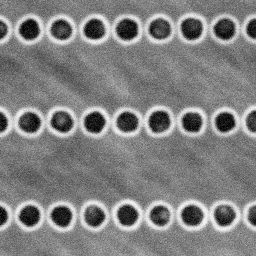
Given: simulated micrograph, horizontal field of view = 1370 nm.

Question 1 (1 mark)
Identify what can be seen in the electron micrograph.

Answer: a regular array of holes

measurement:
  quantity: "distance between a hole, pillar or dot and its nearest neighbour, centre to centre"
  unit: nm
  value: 172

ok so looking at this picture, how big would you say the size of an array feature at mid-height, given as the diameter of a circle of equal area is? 130 nm